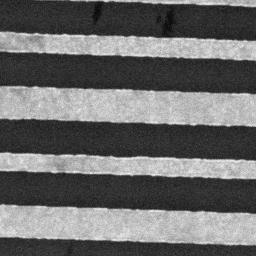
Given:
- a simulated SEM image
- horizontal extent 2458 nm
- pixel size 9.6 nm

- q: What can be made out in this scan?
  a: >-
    lines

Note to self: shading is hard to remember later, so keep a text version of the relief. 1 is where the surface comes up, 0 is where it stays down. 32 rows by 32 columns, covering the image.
00000000000000000000000011111111
00000000000000000000000000000000
00000000000000000000000000000000
00000000000000000000000000000000
11111111111100000000000000000000
11111111111111111111111111111111
00001111111111111111111111111111
00000000000000000000000000000000
00000000000000000000000000000000
00000000000000000000000000000000
00000000000000000000000000000000
11111111111111111111000000000000
11111111111111111111111111111111
11111111111111111111111111111111
11111111111111111111111111111111
00000000000000000000000110111111
00000000000000000000000000000000
00000000000000000000000000000000
00000000000000000000000000000000
11111111111000000000000000000000
11111111111111111111111111111111
00000011111111111111111111111111
00000000000000000000000000000000
00000000000000000000000000000000
00000000000000000000000000000000
00000000000000000000000000000000
11111111111111111111111101000000
11111111111111111111111111111111
11111111111111111111111111111111
11111111111111111111111111111111
00000000000000000000000000001111
00000000000000000000000000000000